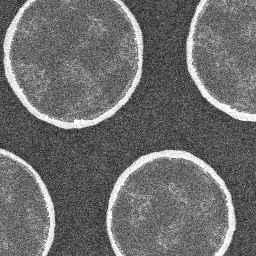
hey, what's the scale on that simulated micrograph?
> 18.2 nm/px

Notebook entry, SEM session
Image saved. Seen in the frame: raised bodies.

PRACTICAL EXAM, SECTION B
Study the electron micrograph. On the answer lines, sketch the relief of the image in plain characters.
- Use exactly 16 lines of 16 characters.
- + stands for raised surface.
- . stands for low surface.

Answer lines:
.+++++++....++++
.+++++++....++++
.++++++++...++++
+++++++++...++++
.++++++++...++++
.+++++++.....+++
..++++++......++
...+++..........
................
................
++......+++++...
+++....+++++++..
+++....+++++++..
+++....++++++++.
+++....+++++++..
+++....+++++++..